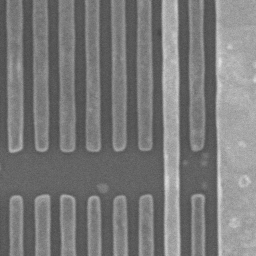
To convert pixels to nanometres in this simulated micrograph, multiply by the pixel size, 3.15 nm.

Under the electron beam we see wiring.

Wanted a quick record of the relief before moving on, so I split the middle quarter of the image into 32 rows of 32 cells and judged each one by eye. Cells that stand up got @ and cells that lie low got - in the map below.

@@----@@@---@@@---@@@@---@@@----
@@----@@@---@@@---@@@@---@@@@---
@@----@@@---@@@---@@@@---@@@@---
@@----@@@---@@@---@@@@---@@@@---
@@----@@@---@@@---@@@@---@@@@---
@@----@@@---@@@---@@@@---@@@@---
@@----@@@---@@@----@@@---@@@@---
@@----@@@---@@@----@@@---@@@@---
@@----@@@---@@@----@@@---@@@@---
@@----@@@---@@@----@@@---@@@@---
@@@---@@@---@@@----@@@---@@@@---
@@@---@@@---@@@----@@@---@@@@---
@@@---@@@---@@@----@@@---@@@@---
@@@---@@@---@@@----@@@---@@@@---
@@@---@@@---@@@----@@@---@@@@---
@@@---@@@---@@@----@@@---@@@@---
@@@---@@@---@@@----@@@---@@@@---
@@@---@@@---@@@----@@@---@@@@---
@@@---@@@---@@@----@@@---@@@@---
@@@---@@@---@@@----@@@---@@@@---
@@@---@@@---@@@----@@@---@@@@---
@@----@@@----@-----------@@@@---
-------------------------@@@@---
-------------------------@@@@---
-------------------------@@@@---
-------------------------@@@@---
-------------------------@@@@---
-------------------------@@@@---
-------------------------@@@@---
-------------------------@@@@---
-------------------------@@@@---
-------------------------@@@@---